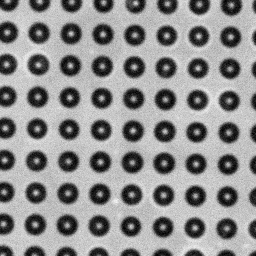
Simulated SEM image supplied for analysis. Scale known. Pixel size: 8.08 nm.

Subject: an array of small figures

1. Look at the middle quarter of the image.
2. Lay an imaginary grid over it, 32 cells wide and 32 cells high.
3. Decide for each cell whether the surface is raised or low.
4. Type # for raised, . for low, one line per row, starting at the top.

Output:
.#...##..#..###..#...##..#..###.
....###.....###.....###.....###.
...#####....###.....###.....###.
#########.#######..######.######
################################
################################
...#####...#####...#####...#####
....###.....###.....###.....###.
.#..###..#..###..#..###..#..###.
....###.....###.....###.....###.
...#####...####.....###.....###.
#################.######...#####
################################
################################
...#####...#####...#####...#####
....###.....###.....###.....###.
.#..##...#..##......##......##..
....###.....###.....##......##..
...####....####....####....####.
#########.######..######..######
################################
################################
...####....####....####....#####
....###.....###.....##......###.
.#..##......##...#..##......##..
....##......##......##......##..
...####....####....####....####.
########################..######
################################
################################
...####....####....####...######
....##.....###......##.....####.